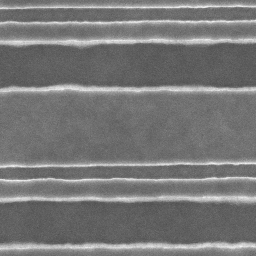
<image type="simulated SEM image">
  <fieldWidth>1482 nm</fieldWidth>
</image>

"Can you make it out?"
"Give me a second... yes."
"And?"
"lines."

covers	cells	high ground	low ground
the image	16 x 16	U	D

UUUUUUUUUUUUUUUU
UUUUUUUUUUUUUUUU
UUUUUUUUUUUUUUUU
DDDDDDDDDDDDDDDD
DDDDDDDDDDDDDDDD
DDDDDDDDDDDDDDDD
UUUUUUUUUUUUUUUU
UUUUUUUUUUUUUUUU
UUUUUUUUUUUUUUUU
UUUUUUUUUUUUUUUU
UUUUUUUUUUUUUUUU
UUUUUUUUUUUUUUUU
DDDDDDDDDDDDDDDD
DDDDDDDDDDDDDDDD
DDDDDDDDDDDDDDDD
DUUDUUUUUUUUUUUU